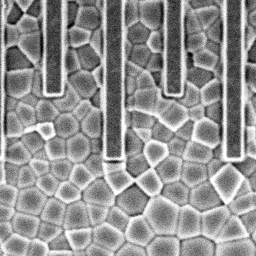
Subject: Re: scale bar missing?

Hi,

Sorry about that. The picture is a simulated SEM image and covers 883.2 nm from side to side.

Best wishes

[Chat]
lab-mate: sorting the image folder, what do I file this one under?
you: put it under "parallel lines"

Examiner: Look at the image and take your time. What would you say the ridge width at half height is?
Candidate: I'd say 62.9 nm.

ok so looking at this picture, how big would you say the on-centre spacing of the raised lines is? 207 nm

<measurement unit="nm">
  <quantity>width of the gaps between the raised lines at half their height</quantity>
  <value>145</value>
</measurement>